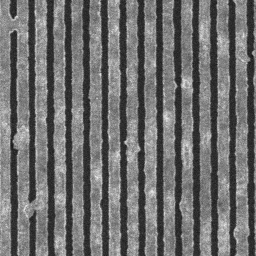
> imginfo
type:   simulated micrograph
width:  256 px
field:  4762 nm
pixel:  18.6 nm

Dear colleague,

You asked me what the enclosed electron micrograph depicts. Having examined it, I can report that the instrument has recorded parallel lines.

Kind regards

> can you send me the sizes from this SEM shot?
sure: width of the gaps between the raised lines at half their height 140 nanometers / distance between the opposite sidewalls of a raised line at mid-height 0.193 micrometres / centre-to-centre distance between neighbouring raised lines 18.2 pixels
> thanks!